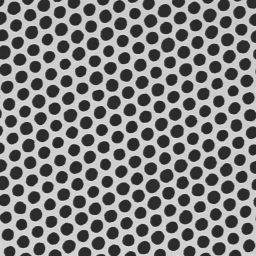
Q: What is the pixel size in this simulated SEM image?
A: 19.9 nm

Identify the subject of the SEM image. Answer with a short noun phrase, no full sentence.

a regular array of holes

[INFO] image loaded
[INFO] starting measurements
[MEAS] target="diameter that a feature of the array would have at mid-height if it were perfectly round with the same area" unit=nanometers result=250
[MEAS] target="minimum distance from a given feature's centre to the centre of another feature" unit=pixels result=17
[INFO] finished